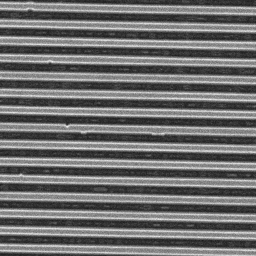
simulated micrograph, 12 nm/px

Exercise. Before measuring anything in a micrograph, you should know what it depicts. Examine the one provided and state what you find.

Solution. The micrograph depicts parallel lines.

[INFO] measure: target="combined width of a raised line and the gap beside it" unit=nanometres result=207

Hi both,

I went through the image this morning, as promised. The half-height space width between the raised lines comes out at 117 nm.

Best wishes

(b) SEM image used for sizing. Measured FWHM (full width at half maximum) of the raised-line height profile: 7.74 px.